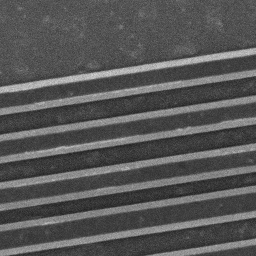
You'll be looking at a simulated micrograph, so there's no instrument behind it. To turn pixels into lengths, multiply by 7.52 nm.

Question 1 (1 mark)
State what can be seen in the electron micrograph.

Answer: parallel lines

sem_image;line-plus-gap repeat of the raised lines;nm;346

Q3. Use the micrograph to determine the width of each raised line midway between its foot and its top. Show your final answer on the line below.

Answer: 22.4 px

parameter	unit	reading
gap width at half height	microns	0.19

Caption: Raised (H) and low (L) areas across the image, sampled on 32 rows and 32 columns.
LLLLLLLLLLLLLLLLLLLLLLLLLLLLLLLL
LLLLLLLLLLLLLLLLLLLLLLLLLLLLLLLL
LLLLLLLLLLLLLLLLLLLLLLLLLLLLLLLL
LLLLLLLLLLLLLLLLLLLLLLLLLLLLLLLL
LLLLLLLLLLLLLLLLLLLLLLLLLLLLLLLL
LLLLLLLLLLLLLLLLLLLLLLLLLLLLLLLL
LLLLLLLLLLLLLLLLLLLLLLLLLLLLLLLH
LLLLLLLLLLLLLLLLLLLLLLLLHHHHHHHH
LLLLLLLLLLLLLLLLLLHHHHHHHHHHHHHH
LLLLLLLLLLLHHHHHHHHHHHHHHHHHHHLL
LLLLLHHHHHHHHHHHHHHHHHHLLLLLLLLL
HHHHHHHHHHHHHHHHLLLLLLLLLLLLLLLL
HHHHHHHHHLLLLLLLLLLLLLLLLLLLLLLH
HHHLLLLLLLLLLLLLLLLLLLLLLHHHHHHH
LLLLLLLLLLLLLLLLLLHHHHHHHHHHHHHH
LLLLLLLLLLLLHHHHHHHHHHHHHHHHHLLL
LLLLLHHHHHHHHHHHHHHHHHHLLLLLLLLL
HHHHHHHHHHHHHHHHLLLLLLLLLLLLLLLL
HHHHHHHHHHLLLLLLLLLLLLLLLLLLLLLH
HHHLLLLLLLLLLLLLLLLLLLLLLHHHHHHH
LLLLLLLLLLLLLLLLLLHHHHHHHHHHHHHH
LLLLLLLLLLLLHHHHHHHHHHHHHHHHHLLL
LLLLLHHHHHHHHHHHHHHHHHHLLLLLLLLL
HHHHHHHHHHHHHHHHLLLLLLLLLLLLLLLL
HHHHHHHHHHLLLLLLLLLLLLLLLLLHHHHH
HHHLLLLLLLLLLLLLLLLLHHHHHHHHHHHH
LLLLLLLLLLLLLLHHHHHHHHHHHHHHHHHH
LLLLLLLHHHHHHHHHHHHHHHHHHHHLLLLL
HHHHHHHHHHHHHHHHHHHHHLLLLLLLLLLL
HHHHHHHHHHHHHHLLLLLLLLLLLLLLLLLL
HHHHHHHHLLLLLLLLLLLLLLLLLLLLLLHH
HLLLLLLLLLLLLLLLLLLLLLLLHHHHHHHH